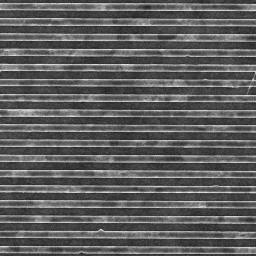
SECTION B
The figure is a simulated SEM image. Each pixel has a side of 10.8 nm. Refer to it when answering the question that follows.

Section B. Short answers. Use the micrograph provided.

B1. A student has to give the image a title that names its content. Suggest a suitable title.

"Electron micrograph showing parallel lines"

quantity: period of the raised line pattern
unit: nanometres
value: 165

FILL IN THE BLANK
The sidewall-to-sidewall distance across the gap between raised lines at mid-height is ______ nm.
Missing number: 90.8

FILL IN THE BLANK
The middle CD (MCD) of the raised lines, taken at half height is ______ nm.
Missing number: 74.5